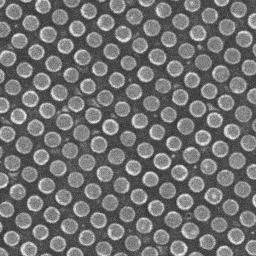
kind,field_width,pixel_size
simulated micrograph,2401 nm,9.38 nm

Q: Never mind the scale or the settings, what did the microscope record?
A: a regular array of raised bodies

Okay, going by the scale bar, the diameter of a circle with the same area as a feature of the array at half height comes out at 145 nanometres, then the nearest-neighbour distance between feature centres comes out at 192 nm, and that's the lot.